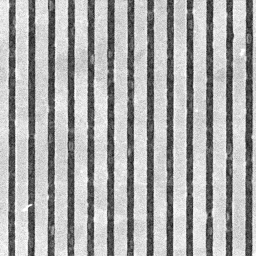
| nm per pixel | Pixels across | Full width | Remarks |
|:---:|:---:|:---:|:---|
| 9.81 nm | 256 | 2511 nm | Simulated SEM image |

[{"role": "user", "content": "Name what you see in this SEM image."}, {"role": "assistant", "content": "parallel lines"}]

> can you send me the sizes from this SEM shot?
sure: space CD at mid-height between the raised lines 72.4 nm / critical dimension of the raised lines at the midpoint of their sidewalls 123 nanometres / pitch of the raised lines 194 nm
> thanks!